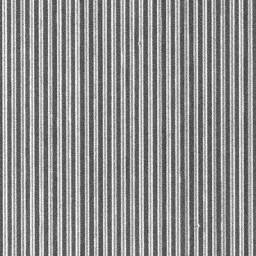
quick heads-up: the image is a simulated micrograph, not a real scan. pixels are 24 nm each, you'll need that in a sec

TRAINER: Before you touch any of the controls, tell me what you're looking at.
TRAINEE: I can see parallel lines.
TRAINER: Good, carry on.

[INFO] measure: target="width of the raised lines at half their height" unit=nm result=72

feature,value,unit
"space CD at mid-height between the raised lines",144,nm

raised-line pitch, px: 9.1